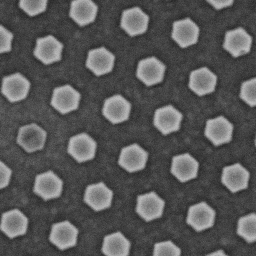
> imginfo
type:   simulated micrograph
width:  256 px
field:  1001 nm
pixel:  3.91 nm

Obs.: a regular array of raised bodies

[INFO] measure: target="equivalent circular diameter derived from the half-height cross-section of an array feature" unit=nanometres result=105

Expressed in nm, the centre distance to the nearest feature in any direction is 199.